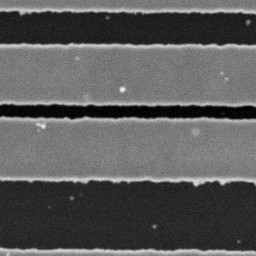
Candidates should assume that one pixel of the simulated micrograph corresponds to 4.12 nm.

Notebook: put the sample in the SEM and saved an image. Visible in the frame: lines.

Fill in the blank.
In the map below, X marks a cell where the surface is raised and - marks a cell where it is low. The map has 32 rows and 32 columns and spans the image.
XXXXXXXXXXXXXXXXXXXXXXXXXXXXXXXX
----X----XX-XXXXXXXXXXXXXXXXXXXX
--------------------------------
--------------------------------
--------------------------------
--XX------X---X-----------------
XXXXXXXXXXXXXXXXXXXXXXXXXXXXXXXX
XXXXXXXXXXXXXXXXXXXXXXXXXXXXXXXX
XXXXXXXXXXXXXXXXXXXXXXXXXXXXXXXX
XXXXXXXXXXXXXXXXXXXXXXXXXXXXXXXX
XXXXXXXXXXXXXXXXXXXXXXXXXXXXXXXX
XXXXXXXXXXXXXXXXXXXXXXXXXXXXXXXX
XXXXXXXXXXXXXXXXXXXXXXXXXXXXXXXX
--------------------------------
--------------------------------
XXXXXXXXXXXXXXXXXXXXXXXXXXXXXXXX
XXXXXXXXXXXXXXXXXXXXXXXXXXXXXXXX
XXXXXXXXXXXXXXXXXXXXXXXXXXXXXXXX
XXXXXXXXXXXXXXXXXXXXXXXXXXXXXXXX
XXXXXXXXXXXXXXXXXXXXXXXXXXXXXXXX
XXXXXXXXXXXXXXXXXXXXXXXXXXXXXXXX
XXXXXXXXXXXXXXXXXXXXXXXXXXXXXXXX
---X--XXXXX-XXXXXXXXXXXXXXXXXXXX
--------------------------------
--------------------------------
--------------------------------
--------------------------------
--------------------------------
--------------------------------
--------------------------------
--------------------------------
XXXXXXXXXXXXXXXXXXXXXXXXXXXXXXXX